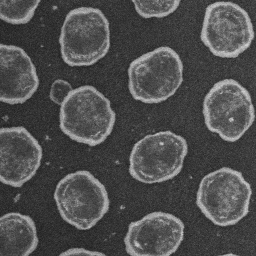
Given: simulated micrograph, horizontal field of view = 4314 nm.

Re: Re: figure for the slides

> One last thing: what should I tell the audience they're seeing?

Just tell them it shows a regular array of raised bodies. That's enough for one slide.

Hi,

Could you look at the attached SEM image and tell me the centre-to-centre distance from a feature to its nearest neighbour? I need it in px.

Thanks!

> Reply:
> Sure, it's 79.1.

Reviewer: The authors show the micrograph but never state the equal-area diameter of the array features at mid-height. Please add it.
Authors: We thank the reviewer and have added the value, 878 nm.